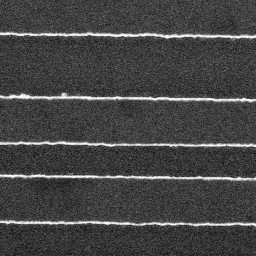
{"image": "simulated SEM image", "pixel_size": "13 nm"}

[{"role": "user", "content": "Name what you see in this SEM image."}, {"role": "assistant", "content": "lines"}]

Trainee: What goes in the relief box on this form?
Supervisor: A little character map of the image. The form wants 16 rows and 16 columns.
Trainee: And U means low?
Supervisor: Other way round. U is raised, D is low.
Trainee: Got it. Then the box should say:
UUUUUUUUUUUUUUUU
UUUUUUUUUUUUUUUU
DDDDDDDDDDDDDDDD
DDDDDDDDDDDDDDDD
DDDDDDDDDDDDDDDD
DDDDDDDDDDDDDDDD
UUUUUUUUUUUUUUUU
UUUUUUUUUUUUUUUU
UUUUUUUUUUUUUUUU
DDDDDDDDDDDDDDDD
DDDDDDDDDDDDDDDD
UUUUUUUUUUUUUUUU
UUUUUUUUUUUUUUUU
UUUUUUUUUUUUUUUU
DDDDDDDDDDDDDDDD
DDDDDDDDDDDDDDDD